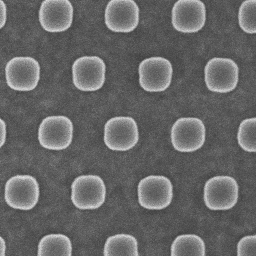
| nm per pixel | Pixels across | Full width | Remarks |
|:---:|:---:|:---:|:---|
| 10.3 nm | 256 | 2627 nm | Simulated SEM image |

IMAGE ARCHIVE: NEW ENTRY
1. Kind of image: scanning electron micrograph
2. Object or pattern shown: a regular array of raised bodies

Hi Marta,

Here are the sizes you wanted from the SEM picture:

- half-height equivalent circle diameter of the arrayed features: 34.6 pixels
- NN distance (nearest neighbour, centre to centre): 0.678 microns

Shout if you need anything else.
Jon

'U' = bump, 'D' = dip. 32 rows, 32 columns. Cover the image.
DDDDDUUUUDDDDDUUUDDDDDUUUDDDDDUU
UDDDDUUUUDDDDUUUUDDDDDUUUUDDDDUU
UDDDDUUUUDDDDUUUUDDDDDUUUUDDDDUU
DDDDDUUUDDDDDDUUUDDDDDUUUDDDDDUU
DDDDDDDDDDDDDDDDDDDDDDDDDDDDDDDD
DDDDDDDDDDDDDDDDDDDDDDDDDDDDDDDD
DDDDDDDDDDDDDDDDDDDDDDDDDDDDDDDD
DUUUDDDDDDUUUDDDDDUUUDDDDDDUUDDD
DUUUUDDDDUUUUDDDDUUUUDDDDDUUUUDD
DUUUUDDDDUUUUDDDDUUUUDDDDDUUUUDD
DUUUUDDDDUUUUDDDDDUUUDDDDDUUUUDD
DDDDDDDDDDDDDDDDDDDDDDDDDDDDDDDD
DDDDDDDDDDDDDDDDDDDDDDDDDDDDDDDD
DDDDDDDDDDDDDDDDDDDDDDDDDDDDDDDD
DDDDDDDDDDDDDDDDDDDDDDDDDDDDDDDD
UDDDDUUUUDDDDUUUUDDDDDUUUDDDDDUU
UDDDDUUUUDDDDUUUUDDDDDUUUDDDDDUU
UDDDDUUUUDDDDUUUUDDDDDUUUDDDDDUU
DDDDDDUUDDDDDDUUDDDDDDUUUDDDDDUU
DDDDDDDDDDDDDDDDDDDDDDDDDDDDDDDD
DDDDDDDDDDDDDDDDDDDDDDDDDDDDDDDD
DDDDDDDDDDDDDDDDDDDDDDDDDDDDDDDD
DUUUDDDDDUUUUDDDDDUUUDDDDDUUUDDD
DUUUUDDDDUUUUDDDDUUUUDDDDDUUUUDD
DUUUUDDDDUUUUDDDDUUUUDDDDDUUUUDD
DUUUDDDDDUUUUDDDDDUUUDDDDDUUUDDD
DDDDDDDDDDDDDDDDDDDDDDDDDDDDDDDD
DDDDDDDDDDDDDDDDDDDDDDDDDDDDDDDD
DDDDDDDDDDDDDDDDDDDDDDDDDDDDDDDD
DDDDDDUUDDDDDDUUDDDDDDDDDDDDDDDD
UDDDDUUUUDDDDUUUUDDDDDUUUDDDDDUU
UDDDDUUUUDDDDUUUUDDDDDUUUDDDDDUU